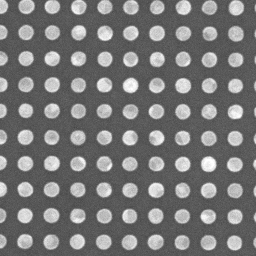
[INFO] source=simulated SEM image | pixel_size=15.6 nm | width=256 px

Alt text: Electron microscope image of a regular array of raised bodies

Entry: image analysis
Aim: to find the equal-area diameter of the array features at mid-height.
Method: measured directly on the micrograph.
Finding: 227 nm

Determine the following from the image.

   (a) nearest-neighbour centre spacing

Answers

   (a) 25.9 pixels